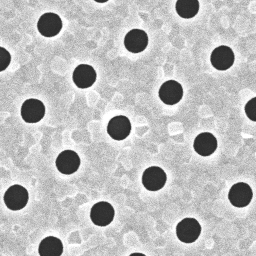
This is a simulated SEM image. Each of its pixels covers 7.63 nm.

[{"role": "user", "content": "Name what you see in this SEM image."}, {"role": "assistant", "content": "a regular array of holes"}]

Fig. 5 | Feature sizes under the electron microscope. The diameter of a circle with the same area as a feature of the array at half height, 192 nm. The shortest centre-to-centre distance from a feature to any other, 473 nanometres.